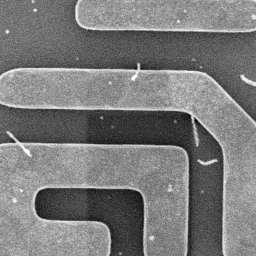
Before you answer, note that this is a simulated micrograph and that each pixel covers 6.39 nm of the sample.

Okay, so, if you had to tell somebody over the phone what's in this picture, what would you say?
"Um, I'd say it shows wiring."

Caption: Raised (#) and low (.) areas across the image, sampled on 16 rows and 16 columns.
.....###########
.....###########
................
................
.###########....
##############..
###############.
............####
.............###
###########...##
############..##
############..##
##.......###..##
###......###..##
#######..###..##
#######..###..##